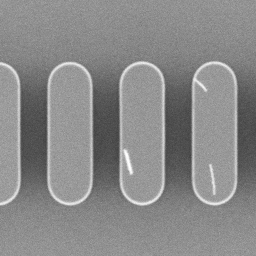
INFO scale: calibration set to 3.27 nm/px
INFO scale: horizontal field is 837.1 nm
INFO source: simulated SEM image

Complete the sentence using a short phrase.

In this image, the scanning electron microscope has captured groups of lines, slits or small figures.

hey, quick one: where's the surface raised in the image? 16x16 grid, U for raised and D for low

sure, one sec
DDDDDDDDDDDDDDDD
DDDDDDDDDDDDDDDD
DDDDDDDDDDDDDDDD
DDDDDDDDDDDDDDDD
UDDUUDDDUUDDUUDD
UDDUUUDDUUDDUUUD
UDDUUUDDUUDDUUUD
UDDUUUDDUUDDUUUD
UDDUUUDDUUDDUUUD
UDDUUUDDUUDDUUUD
UDDUUUDDUUDDUUUD
UDDUUUDDUUDDUUUD
UDDDUDDDUUDDDUDD
DDDDDDDDDDDDDDDD
DDDDDDDDDDDDDDDD
DDDDDDDDDDDDDDDD